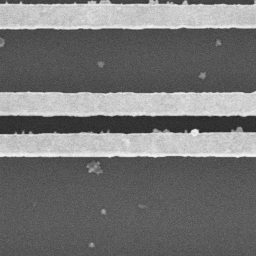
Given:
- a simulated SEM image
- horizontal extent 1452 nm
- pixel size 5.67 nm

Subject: lines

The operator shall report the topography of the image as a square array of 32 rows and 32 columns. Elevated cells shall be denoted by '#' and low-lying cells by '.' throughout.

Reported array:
................................
################################
################################
#####.####.##...##...#..........
................................
................................
................................
................................
................................
................................
................................
................................
################################
################################
.....##..##..#.....#.......#..#.
................................
........................#.......
################################
################################
#################.###...########
................................
................................
................................
................................
................................
................................
................................
................................
................................
................................
................................
................................